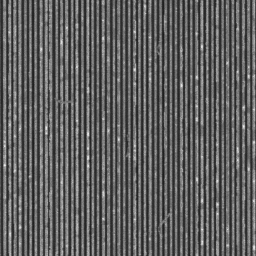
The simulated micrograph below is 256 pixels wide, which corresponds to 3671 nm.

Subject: parallel lines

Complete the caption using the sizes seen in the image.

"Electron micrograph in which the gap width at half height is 0.0377 um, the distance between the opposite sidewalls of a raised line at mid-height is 35.9 nanometers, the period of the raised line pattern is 74.5 nanometres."